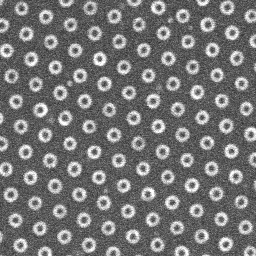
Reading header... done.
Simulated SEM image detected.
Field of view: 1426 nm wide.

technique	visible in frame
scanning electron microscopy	a regular array of ring-shaped raised bodies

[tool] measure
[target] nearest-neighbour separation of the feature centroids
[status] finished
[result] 142 nm